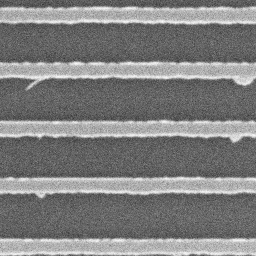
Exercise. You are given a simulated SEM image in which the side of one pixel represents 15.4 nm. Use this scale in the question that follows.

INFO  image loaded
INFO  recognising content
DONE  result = lines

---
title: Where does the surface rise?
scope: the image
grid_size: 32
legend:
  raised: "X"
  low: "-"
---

--------------------------------
XXXXXXXXXXXXXXXXXXXXXXXXXXXXXXXX
XXXXXXXXXXXXXXXXXXXXXXXXXXXXXXXX
--------------------------------
--------------------------------
--------------------------------
--------------------------------
--------------------------------
XXXXXXXXXXXXXXXXXXXXXXXXXXXXXXXX
XXXXXXXXXXXXXXXXXXXXXXXXXXXXXXXX
--------------------------------
--------------------------------
--------------------------------
--------------------------------
--------------------------------
XXXXXXXXXXXXXXXXXXXXXXXXXXXXXXXX
XXXXXXXXXXXXXXXXXXXXXXXXXXXXXXXX
--------------------------------
--------------------------------
--------------------------------
--------------------------------
--------------------------------
XXXXXXXXXXXXXXXXXXXXXXXXXXXXXXXX
XXXXXXXXXXXXXXXXXXXXXXXXXXXXXXXX
--------------------------------
--------------------------------
--------------------------------
--------------------------------
--------------------------------
--------------------------------
XXXXXXXXXXXXXXXXXXXXXXXXXXXXXXXX
XXXXXXXXXXXXXXXXXXXXXXXXXXXXXXXX